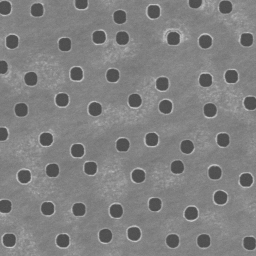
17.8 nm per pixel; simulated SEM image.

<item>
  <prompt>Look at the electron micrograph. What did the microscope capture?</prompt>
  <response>a regular array of holes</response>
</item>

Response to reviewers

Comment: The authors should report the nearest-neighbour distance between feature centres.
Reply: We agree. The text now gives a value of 0.543 um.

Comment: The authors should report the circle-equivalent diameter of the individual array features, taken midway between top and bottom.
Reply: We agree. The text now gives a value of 251 nm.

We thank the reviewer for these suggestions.